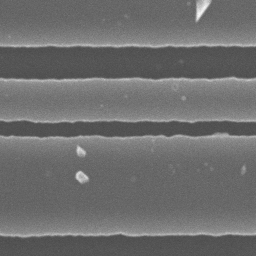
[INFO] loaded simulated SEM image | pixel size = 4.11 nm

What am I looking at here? lines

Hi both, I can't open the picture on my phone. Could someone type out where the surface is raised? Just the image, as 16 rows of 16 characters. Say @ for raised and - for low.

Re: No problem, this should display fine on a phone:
@@@@@@@@@@@@@@@@
@@@@@@@@@@@@@@@@
@@@@@@@@@@@@@@@@
----------------
----------------
@@@@@@@@@@@@@@@@
@@@@@@@@@@@@@@@@
@@@@@@@@@@@@@@@@
@@@@@@@@@@@@@@@@
@@@@@@@@@@@@@@@@
@@@@@@@@@@@@@@@@
@@@@@@@@@@@@@@@@
@@@@@@@@@@@@@@@@
@@@@@@@@@@@@@@@@
@@@@@@@@@@@@@@@@
----------------